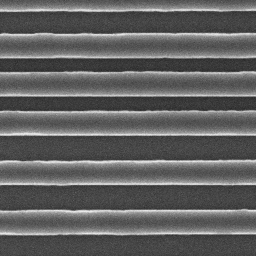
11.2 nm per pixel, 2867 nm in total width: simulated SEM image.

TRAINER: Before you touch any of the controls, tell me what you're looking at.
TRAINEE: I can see lines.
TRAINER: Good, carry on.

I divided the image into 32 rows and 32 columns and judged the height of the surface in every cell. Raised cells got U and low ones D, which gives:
UUUUUUUUUUUUUUUUUUUUUUUUUUUUUUUU
DDDDDDDDDDDDDDDDDDDDDDDDDDDDDDDD
DDDDDDDDDDDDDDDDDDDDDDDDDDDDDDDD
DDDDDDDDDDDDDDDDDDDDDDDDDDDDDDDD
UUUUUUUUUUUUUUUUUUUUUUUUUUUUUUUU
UUUUUUUUUUUUUUUUUUUUUUUUUUUUUUUU
UUUUUUUUUUUUUUUUUUUUUUUUUUUUUUUU
DDDDDDDDDDDDDDDDDDDDDDDDDDDDDDDD
DDDDDDDDDDDDDDDDDDDDDDDDDDDDDDDD
UUUUUUUUUUUUUUUUUUUUUUUUUUUUUUUU
UUUUUUUUUUUUUUUUUUUUUUUUUUUUUUUU
UUUUUUUUUUUUUUUUUUUUUUUUUUUUUUUU
DDDDDDDDDDDDDDDDDDDDDDDDDDDDDDDD
DDDDDDDDDDDDDDDDDDDDDDDDDDDDDDDD
UUUUUUUUUUUUUUUUUUUUUUUUUUUUUUUU
UUUUUUUUUUUUUUUUUUUUUUUUUUUUUUUU
UUUUUUUUUUUUUUUUUUUUUUUUUUUUUUUU
DDDDDDDDDDDDDDDDDDDDDDDDDDDDDDDD
DDDDDDDDDDDDDDDDDDDDDDDDDDDDDDDD
DDDDDDDDDDDDDDDDDDDDDDDDDDDDDDDD
UUUUUUUUUUUUUUUUUUUUUUUUUUUUUUUU
UUUUUUUUUUUUUUUUUUUUUUUUUUUUUUUU
UUUUUUUUUUUUUUUUUUUUUUUUUUUUUUUU
DDDDDDDDDDDDDDDDDDDDDDDDDDDDDDDD
DDDDDDDDDDDDDDDDDDDDDDDDDDDDDDDD
DDDDDDDDDDDDDDDDDDDDDDDDDDDDDDDD
UUUUUUUUUUUUUUUUUUUUUUUUUUUUUUUU
UUUUUUUUUUUUUUUUUUUUUUUUUUUUUUUU
UUUUUUUUUUUUUUUUUUUUUUUUUUUUUUUU
DDDDDDDDDDDDDDDDDDDDDDDDDDDDDDDD
DDDDDDDDDDDDDDDDDDDDDDDDDDDDDDDD
DDDDDDDDDDDDDDDDDDDDDDDDDDDDDDDD